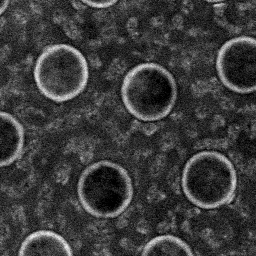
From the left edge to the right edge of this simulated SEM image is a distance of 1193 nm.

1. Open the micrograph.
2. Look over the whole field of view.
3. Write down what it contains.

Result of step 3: raised bodies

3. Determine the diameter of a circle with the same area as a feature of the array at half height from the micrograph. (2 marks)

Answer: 0.244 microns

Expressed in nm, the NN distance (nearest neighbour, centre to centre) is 454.